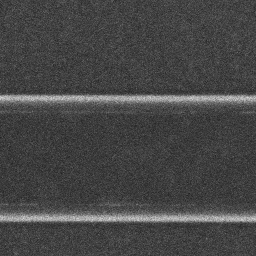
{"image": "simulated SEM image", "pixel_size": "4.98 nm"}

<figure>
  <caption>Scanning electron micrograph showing one or a few lines or trenches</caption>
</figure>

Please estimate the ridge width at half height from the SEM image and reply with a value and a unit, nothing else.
600 nm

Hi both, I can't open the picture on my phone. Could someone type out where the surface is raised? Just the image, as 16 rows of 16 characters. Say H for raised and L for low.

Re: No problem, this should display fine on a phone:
LLLLLLLLLLLLLLLL
LLLLLLLLLLLLLLLL
LLLLLLLLLLLLLLLL
LLLLLLLLLLLLLLLL
LLLLLLLLLLLLLLLL
LLLLLLLLLLLLLLLL
HHHHHHHHHHHHHHHH
HHHHHHHHHHHHHHHH
HHHHHHHHHHHHHHHH
HHHHHHHHHHHHHHHH
HHHHHHHHHHHHHHHH
HHHHHHHHHHHHHHHH
HHHHHHHHHHHHHHHH
HHHHHHHHHHHHHHHH
LLLLLLLLLLLLLLLL
LLLLLLLLLLLLLLLL